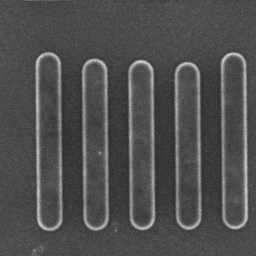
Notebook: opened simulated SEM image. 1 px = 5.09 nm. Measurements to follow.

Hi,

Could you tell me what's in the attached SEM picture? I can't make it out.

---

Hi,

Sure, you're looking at groups of lines, slits or small figures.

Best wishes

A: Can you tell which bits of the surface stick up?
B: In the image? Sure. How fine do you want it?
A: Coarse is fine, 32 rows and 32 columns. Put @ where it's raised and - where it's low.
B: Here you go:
--------------------------------
--------------------------------
--------------------------------
--------------------------------
--------------------------------
--------------------------------
--------------------------------
-----@@---------------------@@--
-----@@@--@@@---@@@---@@@---@@@-
-----@@@--@@@---@@@---@@@---@@@-
-----@@@--@@@---@@@---@@@---@@@-
-----@@@--@@@---@@@---@@@---@@@-
-----@@@--@@@---@@@---@@@---@@@-
-----@@@--@@@---@@@---@@@---@@@-
-----@@@--@@@---@@@---@@@---@@@-
-----@@@--@@@---@@@---@@@---@@@-
-----@@@---@@---@@@---@@@---@@@-
-----@@@---@@---@@@---@@@---@@@-
-----@@@---@@---@@@---@@@---@@@-
-----@@@---@@---@@@---@@@---@@@-
-----@@@---@@---@@@---@@@---@@@-
-----@@@---@@---@@@---@@@---@@@-
-----@@@---@@---@@@---@@@---@@@-
-----@@@---@@---@@@---@@@---@@@-
-----@@@---@@---@@@---@@@---@@@-
-----@@@---@@---@@@---@@@---@@@-
-----@@@---@@---@@@---@@@---@@@-
-----@@@---@@---@@@---@@@---@@@-
------@----@@----@-----@--------
--------------------------------
--------------------------------
--------------------------------